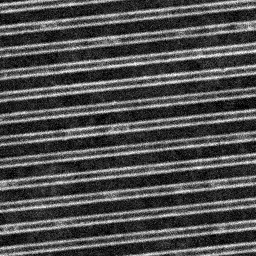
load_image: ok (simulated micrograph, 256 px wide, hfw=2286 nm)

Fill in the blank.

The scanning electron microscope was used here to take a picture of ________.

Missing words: parallel lines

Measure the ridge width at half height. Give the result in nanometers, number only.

65.4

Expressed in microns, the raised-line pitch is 0.197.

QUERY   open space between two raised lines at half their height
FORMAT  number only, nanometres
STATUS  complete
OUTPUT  130